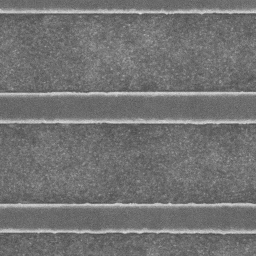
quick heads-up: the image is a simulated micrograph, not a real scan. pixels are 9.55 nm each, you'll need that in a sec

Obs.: lines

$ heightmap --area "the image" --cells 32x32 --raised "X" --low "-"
XXXXXXXXXXXXXXXXXXXXXXXXXXXXXXXX
XXXXXXXXXXX-XXXXXXXXXXXXXXXXXXXX
--------------------------------
--------------------------------
--------------------------------
--------------------------------
--------------------------------
--------------------------------
--------------------------------
--------------------------------
--------------------------------
--------------------------------
XXXXXXXXXXXXXXXXXXXXXXXXXXXXXXXX
XXXXXXXXXXXXXXXXXXXXXXXXXXXXXXXX
XXXXXXXXXXXXXXXXXXXXXXXXXXXXXXXX
--------------------------------
--------------------------------
--------------------------------
--------------------------------
--------------------------------
--------------------------------
--------------------------------
--------------------------------
--------------------------------
--------------------------------
---------------------------XX---
XXXXXXXXXXXXXXXXXXXXXXXXXXXXXXXX
XXXXXXXXXXXXXXXXXXXXXXXXXXXXXXXX
XXXXXXXXXXXXXXXXXXXXXXXXXXXXXXXX
--------------------------------
--------------------------------
--------------------------------